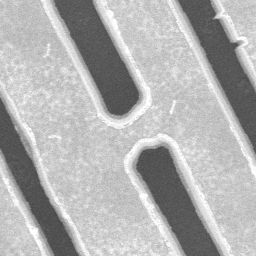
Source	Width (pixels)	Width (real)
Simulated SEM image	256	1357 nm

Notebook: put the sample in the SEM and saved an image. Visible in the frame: one or a few lines or trenches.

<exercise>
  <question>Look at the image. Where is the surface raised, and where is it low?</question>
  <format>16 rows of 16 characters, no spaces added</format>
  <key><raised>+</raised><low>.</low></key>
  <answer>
+++...+++++...++
++++...++++...++
++++...+++++...+
+++++...++++...+
+++++...+++++...
++++++...++++...
.+++++...+++++..
.++++++.++++++..
..+++++++++++++.
..++++++...++++.
...+++++...+++++
+..++++++...++++
+..++++++...++++
++..++++++...+++
++...+++++...+++
+++..++++++...++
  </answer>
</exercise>